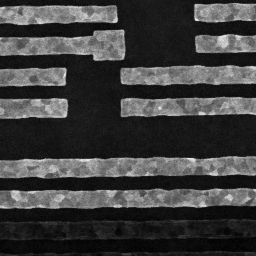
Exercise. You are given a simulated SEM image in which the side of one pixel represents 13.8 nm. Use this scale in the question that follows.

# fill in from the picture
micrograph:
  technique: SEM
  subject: wiring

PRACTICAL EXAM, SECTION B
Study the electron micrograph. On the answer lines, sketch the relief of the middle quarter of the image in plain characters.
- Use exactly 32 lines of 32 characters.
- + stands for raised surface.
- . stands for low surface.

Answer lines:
................................
..............++++++++++++++++++
..............++++++++++++++++++
..............++++++++++++++++++
..............++++++++++++++++++
................................
................................
................................
................................
+.............++++++++++++++++++
+.............++++++++++++++++++
+.............++++++++++++++++++
+.............++++++++++++++++++
................................
................................
................................
................................
................................
................................
................................
................................
................................
................................
......................++++......
++++++++++++++++++++++++++++++++
++++++++++++++++++++++++++++++++
++++++++++++++++++++++++++++++++
++++++++++++++++++++++++++++++++
................................
................................
................................
......................+++..+++++